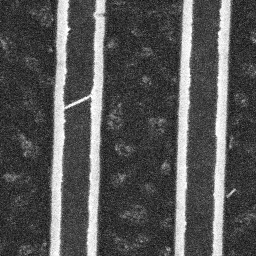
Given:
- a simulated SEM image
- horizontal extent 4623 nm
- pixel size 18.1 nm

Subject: one or a few lines or trenches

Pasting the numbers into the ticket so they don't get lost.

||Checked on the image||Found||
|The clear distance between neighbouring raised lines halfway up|1.55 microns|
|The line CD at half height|39.2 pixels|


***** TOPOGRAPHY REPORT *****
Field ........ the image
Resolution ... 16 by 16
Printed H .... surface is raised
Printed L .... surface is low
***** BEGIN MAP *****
LLLLHHLLLLLLHHLL
LLLLHHLLLLLLHHLL
LLLLHHLLLLLLHHLL
LLLLHHLLLLLLHHLL
LLLLHHLLLLLLHHLL
LLLLHHLLLLLHHHLL
LLLLHHLLLLLHHHLL
LLLLHHLLLLLHHHLL
LLLLHHLLLLLHHHLL
LLLLHHLLLLLHHHLL
LLLLHHLLLLLHHHLL
LLLHHHLLLLLHHHLL
LLLHHHLLLLLHHHLL
LLLHHHLLLLLHHHLL
LLLHHHLLLLLHHHLL
LLLHHHLLLLLHHHLL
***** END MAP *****